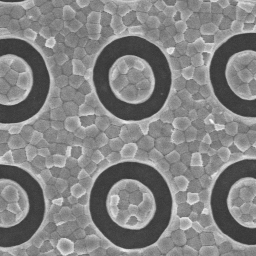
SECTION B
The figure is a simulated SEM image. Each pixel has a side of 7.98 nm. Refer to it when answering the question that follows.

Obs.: ring-shaped grooves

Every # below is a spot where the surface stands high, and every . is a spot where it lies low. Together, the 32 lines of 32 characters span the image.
################################
################################
################################
################################
################.############...
....##########.....#########....
.....########.......#######...##
###..#######...###...#####...###
####..######..#####..#####..####
####..######..#####...####..####
####..######..#####..#####...###
####..######..#####..######..###
###...######...###...######.....
.....########.......########....
....##########.....###########..
################################
################################
################################
################################
################################
###############...###########...
....#########.......########....
.....#######....#....######...##
###..######...####...#####...###
###..######..######..#####..####
####..#####..######...####..####
###...#####...#####..#####...###
###..#######..#####..######..###
.....#######....##...######.....
....#########.......########....
...###########.....###########..
################################